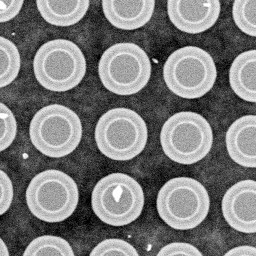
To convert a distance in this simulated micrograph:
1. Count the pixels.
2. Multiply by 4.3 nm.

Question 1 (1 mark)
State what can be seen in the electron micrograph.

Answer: an array of small figures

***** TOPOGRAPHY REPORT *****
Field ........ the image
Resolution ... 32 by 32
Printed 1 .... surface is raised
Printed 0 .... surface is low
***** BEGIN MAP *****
11100111111001111110011111100111
11000111111001111110011111100111
10000011110000111110011111100111
00000000000000011000001111000011
00000000000000000000000000000000
11000011100000011000000000000000
11000111110001111100001111000001
11001111111001111110011111100111
11001111111011111110111111100111
11001111110011111110011111100111
10000111110001111100011111100111
00000000000000111000001111000111
00000000000000000000000000000001
10000111000000000000000000000000
11001111110001111000001110000001
11001111110011111100011111000111
11001111110011111100111111001111
11001111110011111100111111101111
10000111100011111100111111001111
00000011000001111000011111000111
00000000000000000000000000000011
00000111000000000000000000000000
10001111100001111000011100000000
11011111110011111100111111000111
11011111110011111100111111001111
10011111110011111100111111001111
10001111100011111100111111001111
00000111000001111000111110001111
00000000000000000000001100000111
00000100000000000000000000000000
10001111100011110000011000000000
10011111100111111000111110001111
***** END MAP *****